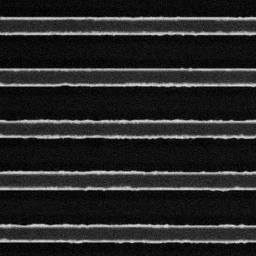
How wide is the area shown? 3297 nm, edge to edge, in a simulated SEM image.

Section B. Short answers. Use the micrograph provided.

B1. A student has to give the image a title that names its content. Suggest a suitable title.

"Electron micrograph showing lines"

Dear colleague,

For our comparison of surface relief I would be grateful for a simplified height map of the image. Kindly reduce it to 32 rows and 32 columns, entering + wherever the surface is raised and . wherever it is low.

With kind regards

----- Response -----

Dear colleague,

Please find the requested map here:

................................
................................
++++++++++++++++++++++++++++++++
++++++++++++++++++++++++++++++++
................................
................................
................................
................................
................................
++++++++++++++++++++++++++++++++
++++++++++++++++++++++++++++++++
................................
................................
................................
................................
++++++++++++++++++++++++++++++++
++++++++++++++++++++++++++++++++
................................
................................
................................
................................
................................
++++++++++++++++++++++++++++++++
++++++++++++++++++++++++++++++++
................................
................................
................................
................................
++++++++++++++++++++++++++++++++
++++++++++++++++++++++++++++++++
................................
................................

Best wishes